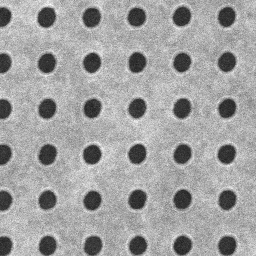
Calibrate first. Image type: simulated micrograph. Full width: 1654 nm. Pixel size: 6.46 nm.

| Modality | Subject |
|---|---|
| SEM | a regular array of holes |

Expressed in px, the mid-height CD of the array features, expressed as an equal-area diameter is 21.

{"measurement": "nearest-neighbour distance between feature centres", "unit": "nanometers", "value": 290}